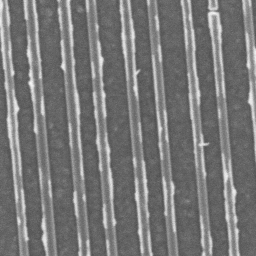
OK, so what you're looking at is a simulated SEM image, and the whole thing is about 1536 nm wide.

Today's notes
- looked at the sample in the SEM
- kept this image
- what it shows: parallel lines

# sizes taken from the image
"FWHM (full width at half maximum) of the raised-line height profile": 9.58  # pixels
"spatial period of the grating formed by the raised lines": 0.18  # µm